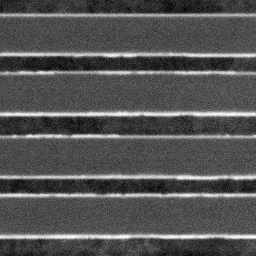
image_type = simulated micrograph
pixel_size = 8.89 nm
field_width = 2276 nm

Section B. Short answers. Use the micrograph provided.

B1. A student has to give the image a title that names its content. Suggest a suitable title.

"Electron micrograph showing lines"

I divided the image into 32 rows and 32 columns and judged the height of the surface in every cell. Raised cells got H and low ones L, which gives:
LLLLLLLLLLLLLLLLLLLLLLLLLLLLLLLL
LLLLLLLLLLLLLLLLLLLLLLLLLLLLLLLL
HHHHHHHHHHHHHHHHHHHHHHHHHHHHHHHH
HHHHHHHHHHHHHHHHHHHHHHHHHHHHHHHH
HHHHHHHHHHHHHHHHHHHHHHHHHHHHHHHH
HHHHHHHHHHHHHHHHHHHHHHHHHHHHHHHH
HHHHHHHHHHHHHHHHHHHHHHHHHHHHHHHH
LLLLLLLLLLLLLLLLLLLLLLLLLLLLLLLL
LLLLLLLLLLLLLLLLLLLLLLLLLLLLLLLL
HHHHHHHHHHHHHHHHHHHHHHHHHHHHHHHH
HHHHHHHHHHHHHHHHHHHHHHHHHHHHHHHH
HHHHHHHHHHHHHHHHHHHHHHHHHHHHHHHH
HHHHHHHHHHHHHHHHHHHHHHHHHHHHHHHH
HHHHHHHHHHHHHHHHHHHHHHHHHHHHHHHH
LLLLLLLLLLLLLLLLLLLLLLLLLLLLLLLL
LLLLLLLLLLLLLLLLLLLLLLLLLLLLLLLL
LLLLLLLLLLLLLLLLLLLLLLLLLLLLLLLL
HHHHHHHHHHHHHHHHHHHHHHHHHHHHHHHH
HHHHHHHHHHHHHHHHHHHHHHHHHHHHHHHH
HHHHHHHHHHHHHHHHHHHHHHHHHHHHHHHH
HHHHHHHHHHHHHHHHHHHHHHHHHHHHHHHH
HHHHHHHHHHHHHHHHHHHHHHHHHHHHHHHH
LLLLLLLLLLLLLLLLLLLLLLLLLLLLLLLL
LLLLLLLLLLLLLLLLLLLLLLLLLLLLLLLL
HHHHHHHHHHHHHHHHHHHHHHHHHHHHHHHH
HHHHHHHHHHHHHHHHHHHHHHHHHHHHHHHH
HHHHHHHHHHHHHHHHHHHHHHHHHHHHHHHH
HHHHHHHHHHHHHHHHHHHHHHHHHHHHHHHH
HHHHHHHHHHHHHHHHHHHHHHHHHHHHHHHH
HHHHHHHHHHHHHHHHHHHHHHHHHHHHHHHH
LLLLLLLLLLLLLLLLLLLLLLLLLLLLLLLL
LLLLLLLLLLLLLLLLLLLLLLLLLLLLLLLL